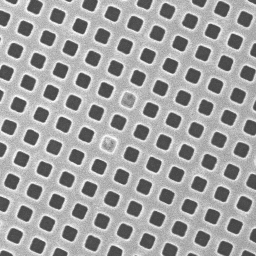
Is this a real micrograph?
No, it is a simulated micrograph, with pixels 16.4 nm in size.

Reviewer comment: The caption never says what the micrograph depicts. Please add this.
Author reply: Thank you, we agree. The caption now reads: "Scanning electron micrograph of a regular array of holes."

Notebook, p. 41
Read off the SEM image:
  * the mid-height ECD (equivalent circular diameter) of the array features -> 245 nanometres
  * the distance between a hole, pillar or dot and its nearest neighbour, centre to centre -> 394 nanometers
